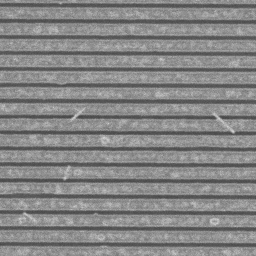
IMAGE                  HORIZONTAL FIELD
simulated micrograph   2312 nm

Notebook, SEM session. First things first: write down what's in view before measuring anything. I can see parallel lines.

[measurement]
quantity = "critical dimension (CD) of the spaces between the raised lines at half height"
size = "0.044 µm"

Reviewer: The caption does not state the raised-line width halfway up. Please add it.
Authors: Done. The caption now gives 99.3 nanometers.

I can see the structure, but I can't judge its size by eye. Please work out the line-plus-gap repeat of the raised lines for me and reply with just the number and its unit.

144 nanometers